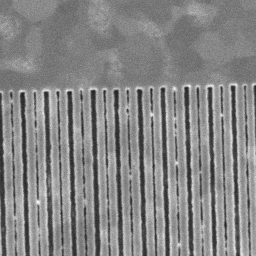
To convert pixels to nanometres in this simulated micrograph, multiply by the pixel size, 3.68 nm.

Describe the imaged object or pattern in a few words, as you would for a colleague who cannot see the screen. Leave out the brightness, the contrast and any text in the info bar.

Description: parallel lines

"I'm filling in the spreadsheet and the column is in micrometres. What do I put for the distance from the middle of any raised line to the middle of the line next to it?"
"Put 0.0429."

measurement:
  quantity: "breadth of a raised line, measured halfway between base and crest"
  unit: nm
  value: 28.5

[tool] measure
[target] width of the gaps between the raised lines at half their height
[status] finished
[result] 18.8 nm